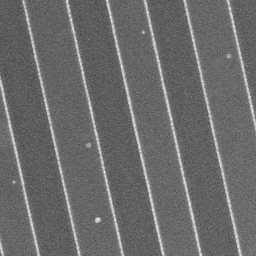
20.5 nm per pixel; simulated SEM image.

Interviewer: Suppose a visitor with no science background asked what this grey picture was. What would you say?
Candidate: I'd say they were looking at lines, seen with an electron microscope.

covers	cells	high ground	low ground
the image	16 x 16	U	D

DDUUDDDUUDDDUUDD
DDUUUDDUUDDDUUUD
DDUUUDDUUUDDUUUD
DDUUUDDUUUDDUUUD
DDUUUDDDUUDDUUUD
DDDUUDDDUUDDDUUD
DDDUUUDDUUUDDUUU
UDDUUUDDUUUDDUUU
UDDUUUDDDUUDDUUU
UDDDUUDDDUUDDDUU
UDDDUUDDDUUDDDUU
UDDDUUUDDUUUDDUU
UUDDUUUDDUUUDDUU
UUDDUUUDDDUUDDUU
UUDDDUUDDDUUDDDU
UUDDDUUUDDUUDDDU